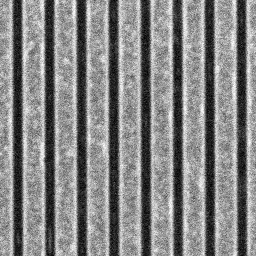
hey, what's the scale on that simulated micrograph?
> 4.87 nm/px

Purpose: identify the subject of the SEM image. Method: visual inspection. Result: parallel lines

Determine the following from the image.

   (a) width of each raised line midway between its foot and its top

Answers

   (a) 103 nm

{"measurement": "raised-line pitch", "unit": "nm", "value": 156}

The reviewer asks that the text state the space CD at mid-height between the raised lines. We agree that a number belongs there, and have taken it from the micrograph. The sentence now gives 0.0517 microns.